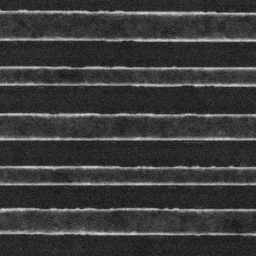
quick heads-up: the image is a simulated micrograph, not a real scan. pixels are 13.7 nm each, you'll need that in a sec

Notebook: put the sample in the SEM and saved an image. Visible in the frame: lines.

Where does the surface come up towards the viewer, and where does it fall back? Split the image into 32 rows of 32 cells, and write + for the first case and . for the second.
................................
+++++++..+......................
++++++++++++++++++++++++++++++++
++++++++++++++++++++++++++++++++
++++++++++++++++++++++++++++++++
................................
................................
................................
..+++++.........................
++++++++++++++++++++++++++++++++
++++++++++++++++++++++++++++++++
................................
................................
................................
++++++++++++++++++++++++++++++++
++++++++++++++++++++++++++++++++
++++++++++++++++++++++++++++++++
................................
................................
................................
................................
++++++++++++++++++++++++++++++++
++++++++++++++++++++++++++++++++
................................
................................
................................
++++++++++++++++++++++++++++++++
++++++++++++++++++++++++++++++++
++++++++++++++++++++++++++++++++
................................
................................
................................